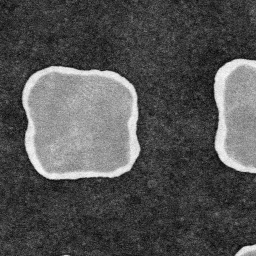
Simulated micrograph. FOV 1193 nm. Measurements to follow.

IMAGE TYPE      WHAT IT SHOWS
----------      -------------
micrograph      raised bodies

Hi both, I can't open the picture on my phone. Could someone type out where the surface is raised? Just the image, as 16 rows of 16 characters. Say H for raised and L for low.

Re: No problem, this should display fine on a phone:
LLLLLLLLLLLLLLLL
LLLLLLLLLLLLLLLL
LLLLLLLLLLLLLLLL
LLLLLLLLLLLLLLLL
LLLHHHLLLLLLLLHH
LLHHHHHHLLLLLLHH
LLHHHHHHLLLLLLHH
LLHHHHHHLLLLLLHH
LLHHHHHHLLLLLLHH
LLHHHHHHLLLLLLHH
LLHHHHHHLLLLLLLH
LLLLLLLLLLLLLLLL
LLLLLLLLLLLLLLLL
LLLLLLLLLLLLLLLL
LLLLLLLLLLLLLLLL
LLLLLLLLLLLLLLLL